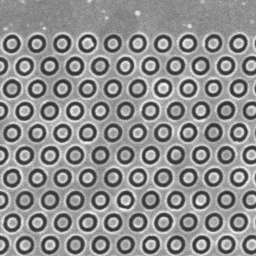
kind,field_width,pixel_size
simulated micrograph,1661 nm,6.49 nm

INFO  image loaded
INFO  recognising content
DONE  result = a regular array of ring-shaped grooves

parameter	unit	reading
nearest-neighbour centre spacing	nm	162